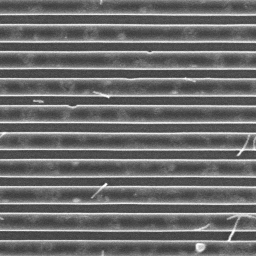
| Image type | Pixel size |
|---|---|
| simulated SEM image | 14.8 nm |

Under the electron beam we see parallel lines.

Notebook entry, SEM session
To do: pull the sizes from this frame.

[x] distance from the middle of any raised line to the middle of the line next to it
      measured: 0.399 um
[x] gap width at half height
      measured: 146 nm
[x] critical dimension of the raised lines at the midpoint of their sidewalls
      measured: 253 nanometers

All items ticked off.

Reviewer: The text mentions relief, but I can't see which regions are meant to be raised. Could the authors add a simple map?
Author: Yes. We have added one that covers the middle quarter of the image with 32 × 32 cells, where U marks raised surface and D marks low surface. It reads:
UUUUUUUUUUUUUUUUUUUUUUUUUUUUUUUU
DDDDDDDDDDDDDDDDDDDDDDDDDDDDDDDD
DDDDDDDDDDDDDDDDDDDDDDDDDDDDDDDD
DDDDDDDDDDDDDDDDDDDDDDDDDDDDDDDD
UUUUUUUUUUUUUUUUUUUUUUUUUUUUUUUU
UUUUUUUUUUUUUUUUUUUUUUUUUUUUUUUU
UUUUUUUUUUUUUUUUUUUUUUUUUUUUUUUU
UUUUUUUUUUUUUUUUUUUUUUUUUUUUUUUU
DDDDDDDDDDDDDDDDDDDDDDDDDDDDDDDD
DDDDDDDDDDDDDDDDDDDDDDDDDDDDDDDD
UUDUUUUUUUUUUUUUUUUUUUUUUUUUUUUU
UUUUUUUUUUUUUUUUUUUUUUUUUUUUUUUU
UUUUUUUUUUUUUUUUUUUUUUUUUUUUUUUU
UUUUUUUUUUUUUUUUUUUUUUUUUUUUUUUU
DDDDDDUUUUUUUUUUUUUUUUUUUUUUUUUU
DDDDDDDDDDDDDDDDDDDDDDDDDDDDDDDD
DDDDDDDDDDDDDDDDDDDDDDDDDDDDDDDD
UUUUUUUUUUUUUUUUUUUUUUUUUUUUUUUU
UUUUUUUUUUUUUUUUUUUUUUUUUUUUUUUU
UUUUUUUUUUUUUUUUUUUUUUUUUUUUUUUU
UUUUUUUUUUUUUUUUUUUUUUUUUUUUUUUU
DDDDDDDDDDDDDDDDDUUDDDDDDDDDDDDD
DDDDDDDDDDDDDDDDDDDDDDDDDDDDDDDD
DDDDDDDDDDDDDDDDDDDDDDDDDDDDDDDD
UUUUUUUUUUUUUUUUUUUUUUUUUUUUUUUU
UUUUUUUUUUUUUUUUUUUUUUUUUUUUUUUU
UUUUUUUUUUUUUUUUUUUUUUUUUUUUUUUU
UUUUUUUUUUUUUUUUUUUUUUUUUUUUUUUU
DDDDDDDDDDDDDDDDDDDDDDDDDDDDDDDD
DDDDDDDDDDDDDDDDDDDDDDDDDDDDDDDD
DDDDDDDDDDUDDDDDDDDDDDDDDDDDDDDD
UUUUUUUUUUUUUUUUUUUUUUUUUUUUUUUU